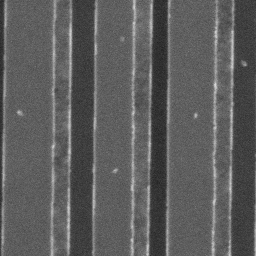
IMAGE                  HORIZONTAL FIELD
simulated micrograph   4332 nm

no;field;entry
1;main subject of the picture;lines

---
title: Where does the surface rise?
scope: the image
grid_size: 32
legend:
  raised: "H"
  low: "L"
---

LHHHHHHHHLLLHHHHHHHLLHHHHHHHHLLL
LHHHHHHHHLLLHHHHHHHLLHHHHHHHHLLL
LHHHHHHHHLLLHHHHHHHLLHHHHHHHHLLL
LHHHHHHHHLLLHHHHHHHLLHHHHHHHHLLL
LHHHHHHHHLLLHHHHHHHLLHHHHHHHHLLL
LHHHHHHHHLLLHHHHHHHLLHHHHHHHHLLL
LHHHHHHHHLLLHHHHHHHLLHHHHHHHHLLL
LHHHHHHHHLLLHHHHHHHLLHHHHHHHHLLL
LHHHHHHHHLLLHHHHHHHLLHHHHHHHHLLL
LHHHHHHHHLLLHHHHHHHLLHHHHHHHHLLL
LHHHHHHHHLLLHHHHHHHLLHHHHHHHHLLL
LHHHHHHHHLLLHHHHHHHLLHHHHHHHHLLL
LHHHHHHHHLLLHHHHHHHLLHHHHHHHHLLL
LHHHHHHHHLLLHHHHHHHLLHHHHHHHHLLL
LHHHHHHHHLLLHHHHHHHLLHHHHHHHHLLL
LHHHHHHHHLLLHHHHHHHLLHHHHHHHHLLL
LHHHHHHHHLLLHHHHHHHLLHHHHHHHHLLL
LHHHHHHHHLLLHHHHHHHLLHHHHHHHHLLL
LHHHHHHHHLLLHHHHHHHLLHHHHHHHHLLL
LHHHHHHHHLLLHHHHHHHLLHHHHHHHHLLL
LHHHHHHHHLLLHHHHHHHLLHHHHHHHHLLL
HHHHHHHHHLLLHHHHHHHLLHHHHHHHHLLL
HHHHHHHHHLLLHHHHHHHLLHHHHHHHHLLL
HHHHHHHHHLLLHHHHHHHLLHHHHHHHHLLL
HHHHHHHHHLLLHHHHHHHLLHHHHHHHHLLL
HHHHHHHHHLLLHHHHHHHLLHHHHHHHHLLL
HHHHHHHHHLLLHHHHHHHLLHHHHHHHHLLL
HHHHHHHHHLLLHHHHHHHLLHHHHHHHHLLL
HHHHHHHHHLLLHHHHHHHLLHHHHHHHHLLL
HHHHHHHHHLLLHHHHHHHLLHHHHHHHHLLL
HHHHHHHHHLLLHHHHHHHLLHHHHHHHHLLL
HHHHHHHHHLLLHHHHHHHLLHHHHHHHHLLL